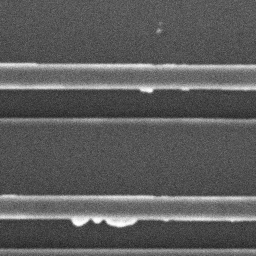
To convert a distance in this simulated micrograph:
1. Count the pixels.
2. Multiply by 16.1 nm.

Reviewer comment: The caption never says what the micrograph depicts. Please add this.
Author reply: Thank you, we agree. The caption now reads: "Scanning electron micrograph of lines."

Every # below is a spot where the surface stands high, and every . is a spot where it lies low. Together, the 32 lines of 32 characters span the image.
................................
................................
................................
................................
................................
................................
................................
................................
################################
################################
################################
................................
................................
................................
................................
................................
................................
................................
................................
................................
................................
................................
................................
................................
##..............................
################################
################################
................................
................................
................................
................................
................................